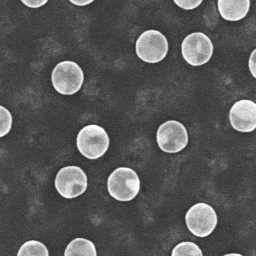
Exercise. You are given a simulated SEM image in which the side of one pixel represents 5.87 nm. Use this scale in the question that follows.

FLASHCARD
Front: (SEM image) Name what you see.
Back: a regular array of raised bodies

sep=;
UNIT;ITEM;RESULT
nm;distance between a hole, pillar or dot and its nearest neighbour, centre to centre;288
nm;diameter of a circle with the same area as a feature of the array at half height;184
